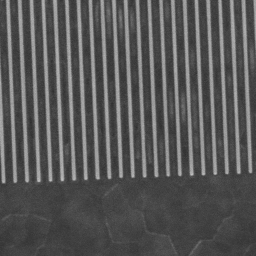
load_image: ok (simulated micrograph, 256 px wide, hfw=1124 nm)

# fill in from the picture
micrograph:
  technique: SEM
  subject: parallel lines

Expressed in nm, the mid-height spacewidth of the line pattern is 37.3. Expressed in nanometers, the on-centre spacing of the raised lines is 51.8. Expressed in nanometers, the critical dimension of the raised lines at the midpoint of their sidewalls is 12.6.